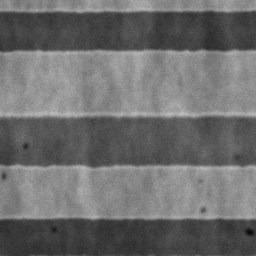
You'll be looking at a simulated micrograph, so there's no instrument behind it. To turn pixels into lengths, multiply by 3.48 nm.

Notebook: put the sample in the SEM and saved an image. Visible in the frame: lines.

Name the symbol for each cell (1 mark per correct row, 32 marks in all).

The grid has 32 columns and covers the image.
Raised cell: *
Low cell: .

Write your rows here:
********************************
................................
................................
................................
................................
................................
..****.*************************
********************************
********************************
********************************
********************************
********************************
********************************
********************************
................................
................................
................................
................................
................................
................................
................................
********************************
********************************
********************************
********************************
********************************
********************************
................................
................................
................................
................................
................................